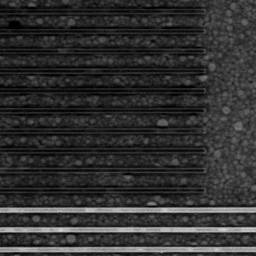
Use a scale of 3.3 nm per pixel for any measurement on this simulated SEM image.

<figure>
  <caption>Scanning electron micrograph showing parallel lines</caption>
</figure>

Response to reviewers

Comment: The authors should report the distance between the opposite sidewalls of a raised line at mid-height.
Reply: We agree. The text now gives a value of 15.7 nm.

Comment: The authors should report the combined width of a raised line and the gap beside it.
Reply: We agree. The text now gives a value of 65.4 nanometers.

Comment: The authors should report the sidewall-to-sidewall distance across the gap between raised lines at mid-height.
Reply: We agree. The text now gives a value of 0.0499 um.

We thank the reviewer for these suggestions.